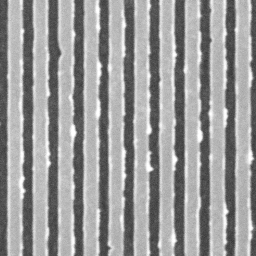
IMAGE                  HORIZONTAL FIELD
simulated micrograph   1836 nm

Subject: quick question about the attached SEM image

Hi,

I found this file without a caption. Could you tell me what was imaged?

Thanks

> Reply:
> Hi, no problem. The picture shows parallel lines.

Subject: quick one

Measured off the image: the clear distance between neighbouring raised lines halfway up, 77.1 nanometers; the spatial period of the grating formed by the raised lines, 182 nm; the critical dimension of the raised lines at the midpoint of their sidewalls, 0.103 um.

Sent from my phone